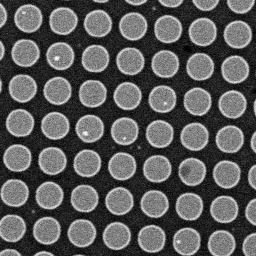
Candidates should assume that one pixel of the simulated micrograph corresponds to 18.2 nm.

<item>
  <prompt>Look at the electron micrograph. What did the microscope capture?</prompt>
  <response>an array of small figures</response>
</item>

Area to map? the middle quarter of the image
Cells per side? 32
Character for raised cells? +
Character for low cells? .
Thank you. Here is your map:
+....++++++..+++++++..++++++...+
......++++....+++++...++++++...+
................++.....+++++...+
................................
+....++++.......................
+...++++++....++++..............
++..++++++...++++++...+++++.....
++..++++++...++++++..+++++++...+
+...++++++...++++++..+++++++..++
....++++++...++++++..+++++++..++
......+++.....++++....+++++...++
.......................++++....+
................................
....+++++......+................
+..++++++....+++++....+++.......
+..+++++++..++++++...++++++....+
+..+++++++..++++++...++++++...++
+..+++++++..++++++...++++++..+++
....+++++...++++++...++++++..+++
......+......++++....++++++..+++
......................+++.....++
................................
....++++.....+++................
...++++++...+++++....++++.......
...++++++..+++++++..++++++...+++
...++++++..+++++++..+++++++..+++
...++++++..+++++++..+++++++..+++
....++++....+++++...+++++++..+++
.............+++.....+++++...+++
..............................++
....++..........................
..++++++....++++................